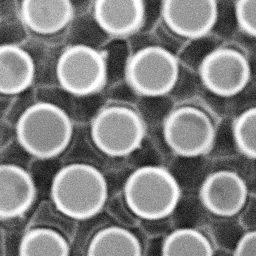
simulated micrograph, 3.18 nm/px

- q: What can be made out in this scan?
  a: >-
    a regular array of raised bodies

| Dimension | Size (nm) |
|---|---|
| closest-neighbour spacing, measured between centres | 222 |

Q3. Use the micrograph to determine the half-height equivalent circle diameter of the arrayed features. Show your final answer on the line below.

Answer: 146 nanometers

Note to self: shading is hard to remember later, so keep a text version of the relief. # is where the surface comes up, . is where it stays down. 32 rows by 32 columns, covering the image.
...######...######...######...##
...######...######...######...##
...#####....######...######...##
....####.....####.....####.....#
................................
................................
###......###......###......##...
####....#####....#####....####..
####...######...######....#####.
####...######...######....#####.
###.....####.....#####....#####.
##.......##.......###......##...
................................
....###.........................
...#####.....####.....####....##
..#######...#####....#####....##
..#######...######...#####...###
...######...#####....#####....##
...#####.....####.....###.....##
................................
................................
###.....####.....###............
####...######...######....####..
####...######...######....#####.
####...######...######...######.
####...######...######....####..
###.....####.....####......##...
................................
................................
...####.....####.....####......#
...#####...######....#####....##
...#####...######...######....##